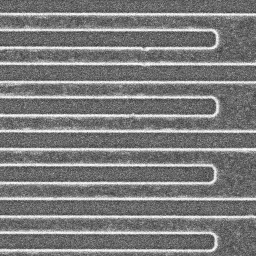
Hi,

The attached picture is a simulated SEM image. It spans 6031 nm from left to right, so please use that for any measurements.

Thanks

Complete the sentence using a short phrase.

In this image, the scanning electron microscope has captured parallel lines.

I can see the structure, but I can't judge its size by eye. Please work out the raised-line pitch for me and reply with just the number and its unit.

0.795 microns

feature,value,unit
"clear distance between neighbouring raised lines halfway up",406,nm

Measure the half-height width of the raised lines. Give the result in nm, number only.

386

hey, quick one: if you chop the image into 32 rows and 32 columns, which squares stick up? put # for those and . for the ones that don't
................................
................................
################################
################################
...........................#####
...........................#####
################################
################################
................................
................................
################################
################################
...........................#####
...........................#####
################################
################################
................................
................................
................................
################################
################################
...........................#####
...........................#####
################################
################################
................................
................................
################################
################################
...........................#####
...........................#####
################################